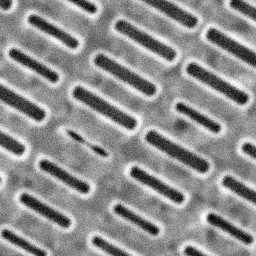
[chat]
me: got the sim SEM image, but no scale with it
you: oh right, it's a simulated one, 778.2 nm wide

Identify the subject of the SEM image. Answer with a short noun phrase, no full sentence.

a regular array of holes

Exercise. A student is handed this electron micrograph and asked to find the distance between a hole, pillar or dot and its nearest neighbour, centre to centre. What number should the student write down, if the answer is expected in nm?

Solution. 119